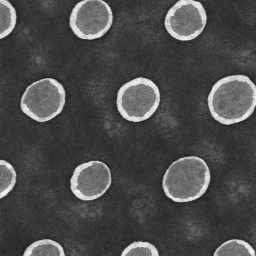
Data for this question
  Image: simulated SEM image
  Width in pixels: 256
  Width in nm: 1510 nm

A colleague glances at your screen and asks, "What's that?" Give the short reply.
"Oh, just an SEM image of raised bodies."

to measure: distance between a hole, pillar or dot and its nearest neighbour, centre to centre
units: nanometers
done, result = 550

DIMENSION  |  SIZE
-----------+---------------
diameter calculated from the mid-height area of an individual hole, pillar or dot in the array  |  249 nm